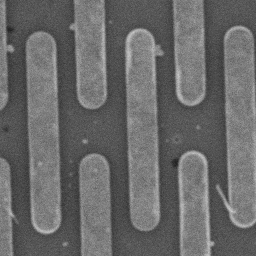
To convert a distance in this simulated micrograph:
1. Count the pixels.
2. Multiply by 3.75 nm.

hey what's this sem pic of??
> groups of lines, slits or small figures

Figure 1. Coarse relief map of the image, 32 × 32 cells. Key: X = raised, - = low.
X--------XXXX---------XXX-------
X--------XXXX---------XXX-------
X--------XXXX---------XXX-------
X--------XXXX---------XXX-------
X---XX---XXXX---XXX---XXX---XXX-
X--XXXX--XXXX---XXX---XXX---XXXX
X--XXXX---XXX---XXX---XXX---XXXX
X--XXXX---XXX---XXX---XXX---XXXX
X--XXXX---XXX---XXX---XXXX--XXXX
X--XXXX---XXX---XXX---XXXX--XXXX
X---XXX---XXX---XXX---XXXX--XXXX
X---XXX---XXX---XXX---XXXX--XXXX
X---XXX---XXX---XXXX---XX---XXXX
----XXX----X----XXXX--------XXXX
----XXX---------XXXX--------XXXX
----XXX---------XXXX--------XXXX
----XXX---------XXXX--------XXXX
----XXX---------XXXX--------XXXX
----XXX---------XXXX---------XXX
----XXX----XX---XXXX---XX----XXX
X---XXX---XXX---XXXX--XXXX---XXX
X---XXX---XXXX--XXXX--XXXX---XXX
X---XXX---XXXX--XXXX---XXX---XXX
X---XXX---XXXX--XXXX---XXX---XXX
X---XXX---XXXX--XXXX---XXX---XXX
X---XXX---XXXX--XXXX---XXX--XXXX
X---XXX---XXXX--XXXX---XXX---XXX
X---XXX---XXXX--XXXX---XXX---XXX
X----XX---XXXX---XX----XXX------
X---------XXXX---------XXX------
X---------XXXX---------XXX------
X---------XXXX---------XXX------